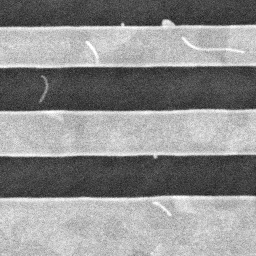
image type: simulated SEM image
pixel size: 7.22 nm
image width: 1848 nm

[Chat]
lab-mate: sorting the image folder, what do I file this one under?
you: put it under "wiring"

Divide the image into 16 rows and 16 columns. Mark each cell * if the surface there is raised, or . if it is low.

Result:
................
................
****************
****************
................
................
................
****************
****************
****************
................
................
****************
****************
****************
****************